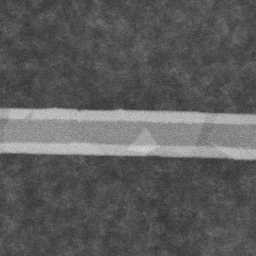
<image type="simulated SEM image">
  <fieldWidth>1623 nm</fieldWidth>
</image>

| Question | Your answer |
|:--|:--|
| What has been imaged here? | one or a few lines or trenches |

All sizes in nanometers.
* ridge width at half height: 206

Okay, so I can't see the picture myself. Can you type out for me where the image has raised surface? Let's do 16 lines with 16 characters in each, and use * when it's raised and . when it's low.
................
................
................
................
................
................
................
***************.
****************
..............**
................
................
................
................
................
................